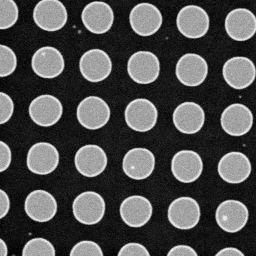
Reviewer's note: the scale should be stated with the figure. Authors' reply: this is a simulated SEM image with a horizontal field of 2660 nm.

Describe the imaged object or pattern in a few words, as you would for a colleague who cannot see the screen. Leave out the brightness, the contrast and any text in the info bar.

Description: an array of small figures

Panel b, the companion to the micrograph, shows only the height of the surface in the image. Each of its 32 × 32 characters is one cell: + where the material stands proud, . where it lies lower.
++...+++...++.....+.............
++..++++..++++..++++..++++...++.
++..++++..++++..++++..++++..++++
+....+++...+++...+++..++++..++++
.......................++....++.
................................
++...++....++....+..............
++..++++..++++..++++..+++....++.
++..++++..++++..++++..++++..++++
+....++...+++...++++..++++..++++
.......................++....++.
................................
+...+++...+++....+..............
++..++++..++++..+++...+++...+++.
+...++++..++++..++++..+++...++++
.....++...+++...+++...+++...+++.
.......................+....+++.
................................
+...+++...++....................
+..++++..++++...+++...+++...+++.
+..++++..++++..++++..++++..++++.
....++....+++...+++...+++..++++.
......................++....++..
................................
+...++....++....................
+..++++..++++..++++..++++...++..
+..++++..++++..++++..++++..++++.
....++....++...++++..++++..++++.
......................++....++..
................................
+..+++....++....+...............
+..++++..++++..+++...+++...+++..